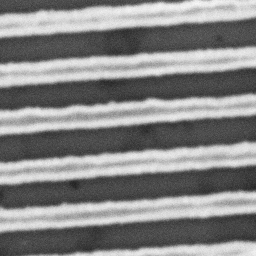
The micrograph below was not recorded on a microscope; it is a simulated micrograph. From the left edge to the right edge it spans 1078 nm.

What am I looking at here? lines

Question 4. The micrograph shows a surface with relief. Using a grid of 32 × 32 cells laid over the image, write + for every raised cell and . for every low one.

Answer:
.......................+++++++++
..........++++++++++++++++++++++
++++++++++++++++++++++++++......
+++++++++++.....................
................................
................................
...........................+++++
...........+++++++++++++++++++++
+++++++++++++++++++++++++++++...
+++++++++++++++++...............
................................
................................
........................+...++++
.........+++++++++++++++++++++++
+++++++++++++++++++++++++++.....
+++++++++++++++.................
+...............................
................................
..........................++++++
.............+++++++++++++++++++
.++++++++++++++++++++++++++++++.
+++++++++++++++++...............
++++............................
................................
...........................+++++
.............+++++++++++++++++++
++++++++++++++++++++++++++++++..
+++++++++++++++++...............
++..............................
................................
.............................++.
...............+.+++++++++++++++